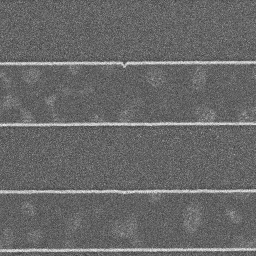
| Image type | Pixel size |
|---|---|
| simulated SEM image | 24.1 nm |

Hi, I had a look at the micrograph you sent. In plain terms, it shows one or a few lines or trenches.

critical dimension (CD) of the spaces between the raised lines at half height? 1620 nm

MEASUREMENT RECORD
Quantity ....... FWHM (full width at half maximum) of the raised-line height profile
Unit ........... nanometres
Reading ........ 1430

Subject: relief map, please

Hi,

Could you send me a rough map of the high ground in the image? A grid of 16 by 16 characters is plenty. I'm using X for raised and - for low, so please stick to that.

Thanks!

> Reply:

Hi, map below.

----------------
----------------
----------------
----------------
XXXXXXXXXXXXXXXX
XXXXXXXXXXXXXXXX
XXXXXXXXXXXXXXXX
XXXXXXXXXXXXXXXX
----------------
----------------
----------------
----------------
XXXXXXXXXXXXXXXX
XXXXXXXXXXXXXXXX
XXXXXXXXXXXXXXXX
XXXXXXXXXXXXXXXX